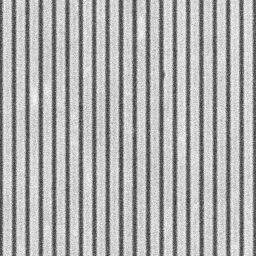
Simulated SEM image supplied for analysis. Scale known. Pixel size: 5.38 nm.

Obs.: parallel lines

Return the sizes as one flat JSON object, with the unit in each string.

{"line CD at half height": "41.7 nm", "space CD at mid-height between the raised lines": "31 nm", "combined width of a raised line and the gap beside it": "71.9 nanometers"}